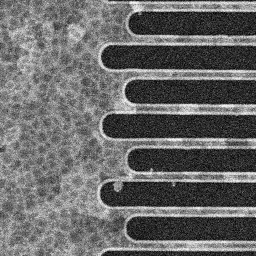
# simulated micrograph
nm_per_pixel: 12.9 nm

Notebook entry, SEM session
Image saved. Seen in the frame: parallel lines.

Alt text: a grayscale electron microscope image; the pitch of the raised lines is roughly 442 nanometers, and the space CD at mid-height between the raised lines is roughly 352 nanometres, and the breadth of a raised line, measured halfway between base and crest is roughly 88.9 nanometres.